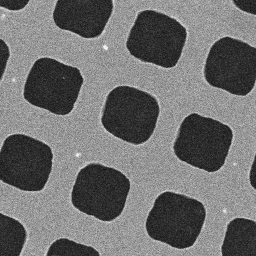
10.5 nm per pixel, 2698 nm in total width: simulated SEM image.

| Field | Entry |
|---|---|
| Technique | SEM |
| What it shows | holes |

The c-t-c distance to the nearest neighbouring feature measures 843 nanometers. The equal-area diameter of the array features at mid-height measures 600 nanometers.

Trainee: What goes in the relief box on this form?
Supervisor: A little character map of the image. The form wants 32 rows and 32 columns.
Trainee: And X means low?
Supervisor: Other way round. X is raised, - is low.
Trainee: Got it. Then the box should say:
---XXXX-------XXXXXXXXXXXXXXX---
XXXXXXX-------XXXX--XXXXXXXXXXX-
XXXXXXX-------XXX-----XXXXXXXXXX
XXXXXXX------XXX-------XXXXXXXXX
XXXXXXXXXX--XXXX-------XXXXXXXXX
-XXXXXXXXXXXXXXX-------XXXX----X
-XXXXXXXXXXXXXXX-------XXX------
-XXXX--XXXXXXXXXX-----XXXX------
-XXX-----XXXXXXXXXXXXXXXXX------
XXX-------XXXXXXXXXXXXXXXX------
XXX-------XXXXXXXXXXXXXXXX------
XXX-------XXXX----XXXXXXXXXX---X
XXX-------XXX-------XXXXXXXXXXXX
XXXXX----XXXX-------XXXXXXXXXXXX
XXXXXXXXXXXXX-------XXX--XXXXXXX
XXXXXXXXXXXXX-------XXX-----XXXX
XXXXXXXXXXXXXX-----XXX-------XXX
X----XXXXXXXXXX---XXXX-------XXX
------XXXXXXXXXXXXXXXX-------XXX
-------XXXXXXXXXXXXXXX------XXXX
-------XXXX-XXXXXXXXXXXX----XXXX
------XXXX-----XXXXXXXXXXX-XXXX-
------XXXX------XXXXXXXXXXXXXXX-
XX---XXXX-------XXXXXXXXXXXXXXXX
XXXXXXXXX-------XXXX---XXXXXXXXX
XXXXXXXXX-------XXX------XXXXXXX
XXXXXXXXXX-----XXXX-------XXXXXX
--XXXXXXXXXXX-XXXX--------XXX--X
---XXXXXXXXXXXXXXX-------XXX----
---XXXXXXXXXXXXXXXX------XXX----
---XXXX---XXXXXXXXXXX---XXXX----
---XXX------XXXXXXXXXXXXXXXX----